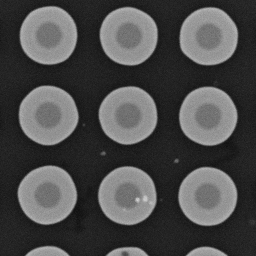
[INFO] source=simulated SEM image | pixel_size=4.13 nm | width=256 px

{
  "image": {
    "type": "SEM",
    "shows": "an array of small figures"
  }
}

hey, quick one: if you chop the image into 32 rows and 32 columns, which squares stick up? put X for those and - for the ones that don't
--------------------------------
----XXXX------XXXX------XXXX----
---XXXXXX----XXXXXX----XXXXXX---
---XXXXXXX---XXXXXXX---XXXXXXX--
---XXXXXXX--XXXXXXXX--XXXXXXXX--
---XXXXXX----XXXXXXX--XXXXXXXX--
---XXXXXX----XXXXXX----XXXXXX---
----XXXX------XXXX------XXXX----
--------------------------------
--------------------------------
--------------------------------
----XXXX------XXXX------XXXX----
---XXXXXX----XXXXXX----XXXXXX---
--XXXXXXXX--XXXXXXXX---XXXXXX---
--XXXXXXXX--XXXXXXXX--XXXXXXXX--
---XXXXXXX---XXXXXXX--XXXXXXXX--
---XXXXXX----XXXXXX----XXXXXX---
----XXXX------XXXX------XXXX----
--------------------------------
--------------------------------
--------------------------------
----XXXX------XXXX------XXXX----
---XXXXXX----XXXXXX----XXXXXX---
--XXXXXXX---XXXXXXX---XXXXXXX---
--XXXXXXXX--XXXXXXXX--XXXXXXXX--
--XXXXXXX---XXXXXXX---XXXXXXXX--
---XXXXXX----XXXXXX----XXXXXX---
----XXXX------XXXX------XXXX----
--------------------------------
--------------------------------
--------------------------------
----XXXX------XXXX------XXXX----